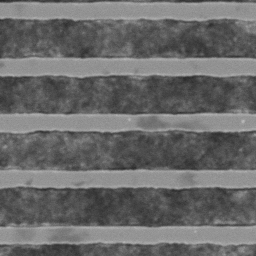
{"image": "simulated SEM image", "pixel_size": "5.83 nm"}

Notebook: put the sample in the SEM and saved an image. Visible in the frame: lines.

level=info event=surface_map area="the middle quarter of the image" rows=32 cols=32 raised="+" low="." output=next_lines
++++++++++++++++++++++++++++++++
++++++++++++++++++++++++++++++++
++++++++++++++++++++++++++++++++
................................
................................
................................
................................
................................
................................
................................
................................
................................
................................
++++++++++++++++++++++++++++++++
++++++++++++++++++++++++++++++++
++++++++++++++++++++++++++++++++
.+++++++++++++++...+++++++....++
................................
................................
................................
................................
................................
................................
................................
................................
................................
................+.+++...........
++++++++++++++++++++++++++++++++
++++++++++++++++++++++++++++++++
++++++++++++++++++++++++++++++++
++++++++++++++++++++++++++++++++
................................